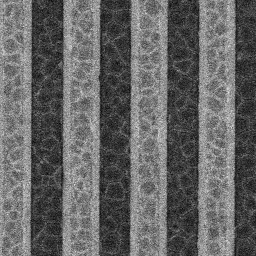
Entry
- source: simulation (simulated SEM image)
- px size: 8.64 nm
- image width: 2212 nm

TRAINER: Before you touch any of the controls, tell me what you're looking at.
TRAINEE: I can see one or a few lines or trenches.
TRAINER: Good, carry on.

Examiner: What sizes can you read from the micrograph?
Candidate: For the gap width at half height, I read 345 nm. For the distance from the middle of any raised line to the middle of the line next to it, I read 585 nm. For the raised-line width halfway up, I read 0.246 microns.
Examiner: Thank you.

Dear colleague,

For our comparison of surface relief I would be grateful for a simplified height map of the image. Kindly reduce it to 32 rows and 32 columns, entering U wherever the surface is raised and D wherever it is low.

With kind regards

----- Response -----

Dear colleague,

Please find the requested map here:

UUUDDDDDDUUUDDDDDUUUDDDDDUUUUDDD
UUUDDDDDUUUUDDDDDUUUDDDDDUUUUDDD
UUUDDDDDUUUUDDDDDUUUDDDDDUUUUDDD
UUUDDDDDUUUUDDDDDUUUDDDDDUUUUDDD
UUUDDDDDUUUUDDDDDUUUDDDDDUUUUDDD
UUUDDDDDUUUUDDDDDUUUDDDDDUUUUDDD
UUUDDDDDUUUUDDDDDUUUDDDDDUUUUDDD
UUUDDDDDDUUUDDDDDUUUDDDDDUUUUDDD
UUUDDDDDUUUUDDDDDUUUDDDDDUUUUDDD
UUUDDDDDUUUUDDDDDUUUDDDDDUUUUDDD
UUUDDDDDUUUUDDDDDUUUDDDDDUUUUDDD
UUUDDDDDUUUUDDDDDUUUDDDDDUUUUDDD
UUUDDDDDUUUUDDDDDUUUDDDDDUUUUDDD
UUUDDDDDUUUUDDDDDUUUDDDDDUUUUDDD
UUUDDDDDUUUUDDDDDUUUDDDDDUUUUDDD
UUUDDDDDUUUUDDDDDUUUDDDDDUUUUDDD
UUUDDDDDUUUUDDDDDUUUDDDDDUUUUDDD
UUUDDDDDUUUUDDDDDUUUDDDDDUUUUDDD
UUUDDDDDUUUUDDDDDUUUDDDDDUUUUDDD
UUUDDDDDUUUUDDDDDUUUDDDDDUUUUDDD
UUUDDDDDUUUUDDDDDUUUDDDDDUUUUDDD
UUUDDDDDUUUUDDDDDUUUDDDDDUUUUDDD
UUUDDDDDUUUUDDDDDUUUDDDDDUUUUDDD
UUUDDDDDUUUUDDDDDUUUDDDDDUUUUDDD
UUUDDDDDUUUUDDDDDUUUDDDDDUUUUDDD
UUUDDDDDUUUUDDDDDUUUDDDDDUUUUDDD
UUUDDDDDUUUUDDDDDUUUDDDDDUUUUDDD
UUUDDDDDUUUUDDDDDUUUDDDDDUUUUDDD
UUUDDDDDUUUUDDDDDUUUDDDDDUUUUDDD
UUUDDDDDUUUUDDDDDUUUDDDDDUUUUDDD
UUUDDDDDUUUUDDDDDUUUDDDDDUUUUDDD
UUUDDDDDUUUUDDDDDUUUDDDDDUUUUDDD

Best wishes